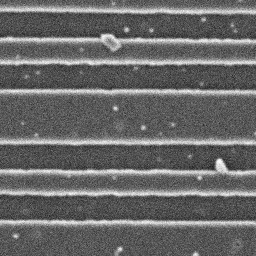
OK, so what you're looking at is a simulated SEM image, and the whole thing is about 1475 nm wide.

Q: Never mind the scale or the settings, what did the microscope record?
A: lines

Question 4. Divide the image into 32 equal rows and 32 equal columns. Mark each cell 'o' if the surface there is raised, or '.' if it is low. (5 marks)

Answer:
oooooooooooooooooooooooooooooooo
.................oo..ooooooooooo
................................
................................
.............o..................
oooooooooooooooooooooooooooooooo
oooooooooooooooooooooooooooooooo
oooooooooooooooooooooooooooooooo
................................
................................
................................
oooooooooooooooooooooooooooooooo
oooooooooooooooooooooooooooooooo
oooooooooooooooooooooooooooooooo
oooooooooooooooooooooooooooooooo
oooooooooooooooooooooooooooooooo
oooooooooooooooooooooooooooooooo
oooooooooooooooooooooooooooooooo
................................
................................
...........................o....
oooooooooooooooooooooooooooooooo
oooooooooooooooooooooooooooooooo
oooooooooooooooooooooooooooooooo
............................o...
................................
................................
................................
oooooooooooooooooooooooooooooooo
oooooooooooooooooooooooooooooooo
oooooooooooooooooooooooooooooooo
oooooooooooooooooooooooooooooooo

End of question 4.